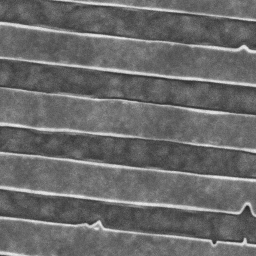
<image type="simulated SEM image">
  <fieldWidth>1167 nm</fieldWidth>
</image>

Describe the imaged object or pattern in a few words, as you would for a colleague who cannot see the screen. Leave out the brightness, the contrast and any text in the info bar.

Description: one or a few lines or trenches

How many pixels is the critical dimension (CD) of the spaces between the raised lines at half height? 29.9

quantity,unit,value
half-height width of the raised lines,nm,156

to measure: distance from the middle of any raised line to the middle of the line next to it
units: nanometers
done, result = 293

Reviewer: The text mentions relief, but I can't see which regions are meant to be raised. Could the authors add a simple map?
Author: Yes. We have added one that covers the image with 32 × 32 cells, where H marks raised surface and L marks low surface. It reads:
LLLLLLLLLLLLHHHHHHHHHHHHHHHHHHHH
LLLLLLLLLLLLLLLLLLLLLLLHHHHHHHHH
LLLLLLLLLLLLLLLLLLLLLLLLLLLLLLLH
HHHHHLLLLLLLLLLLLLLLLLLLLLLLLLLL
HHHHHHHHHHHHHLLLLLLLLLLLLLLLLLLL
HHHHHHHHHHHHHHHHHHHHHHHLLLLLLLLL
HHHHHHHHHHHHHHHHHHHHHHHHHHHHHHHH
LLLHHHHHHHHHHHHHHHHHHHHHHHHHHHHH
LLLLLLLLLLLHHHHHHHHHHHHHHHHHHHHH
LLLLLLLLLLLLLLLLLLLLHHHHHHHHHHHH
LLLLLLLLLLLLLLLLLLLLLLLLLLLLLLHH
HHHHLLLLLLLLLLLLLLLLLLLLLLLLLLLL
HHHHHHHHHHHHHHHLLLLLLLLLLLLLLLLL
HHHHHHHHHHHHHHHHHHHHHHHLLLLLLLLL
HHHHHHHHHHHHHHHHHHHHHHHHHHHHHHHH
LHHHHHHHHHHHHHHHHHHHHHHHHHHHHHHH
LLLLLLLLLLHHHHHHHHHHHHHHHHHHHHHH
LLLLLLLLLLLLLLLLLLLLHHHHHHHHHHHH
LLLLLLLLLLLLLLLLLLLLLLLLLLLLLHHH
HHHHLLLLLLLLLLLLLLLLLLLLLLLLLLLL
HHHHHHHHHHHHHLLLLLLLLLLLLLLLLLLL
HHHHHHHHHHHHHHHHHHHHHHLLLLLLLLLL
HHHHHHHHHHHHHHHHHHHHHHHHHHHHHHHL
LHHHHHHHHHHHHHHHHHHHHHHHHHHHHHHH
LLLLLLLLLHHHHHHHHHHHHHHHHHHHHHHH
LLLLLLLLLLLLLLLLLHHHHHHHHHHHHHHH
LLLLLLLLLLLLLLLLLLLLLLLLLLLLHHLL
HHHLLLLLLLLLLLLLLLLLLLLLLLLLLLLL
HHHHHHHHHHHHHLLLLLLLLLLLLLLLLLLL
HHHHHHHHHHHHHHHHHHHHHLLLLLLLLLLL
HHHHHHHHHHHHHHHHHHHHHHHHHHHHHHHL
HHHHHHHHHHHHHHHHHHHHHHHHHHHHHHHH